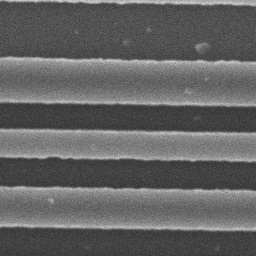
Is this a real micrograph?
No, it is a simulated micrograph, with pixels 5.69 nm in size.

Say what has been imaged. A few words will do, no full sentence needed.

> lines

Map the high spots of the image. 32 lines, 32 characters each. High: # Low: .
.........................##..###
................................
................................
................................
................................
................................
................................
#########...#...................
################################
################################
################################
################################
################################
................................
................................
................................
#################...............
################################
################################
################################
................................
................................
................................
####..#.........................
################################
################################
################################
################################
...................#.###########
................................
................................
................................